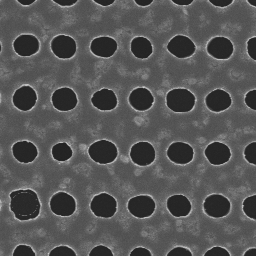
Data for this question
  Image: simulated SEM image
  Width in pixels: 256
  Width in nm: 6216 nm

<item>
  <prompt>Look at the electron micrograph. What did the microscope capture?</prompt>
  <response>a regular array of holes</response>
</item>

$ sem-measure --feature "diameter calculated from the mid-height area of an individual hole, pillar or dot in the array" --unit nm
588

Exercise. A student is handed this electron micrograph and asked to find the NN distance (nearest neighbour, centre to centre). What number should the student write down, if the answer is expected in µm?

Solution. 0.915